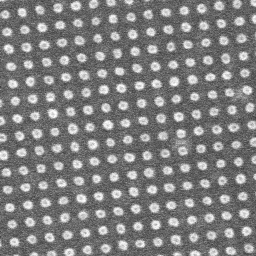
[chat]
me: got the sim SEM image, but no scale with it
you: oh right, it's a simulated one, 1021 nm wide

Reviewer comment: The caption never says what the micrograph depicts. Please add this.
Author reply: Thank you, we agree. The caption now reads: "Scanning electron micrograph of a regular array of raised bodies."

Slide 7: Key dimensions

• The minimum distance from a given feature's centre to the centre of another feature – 68.4 nanometers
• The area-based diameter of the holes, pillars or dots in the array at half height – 30.2 nanometres